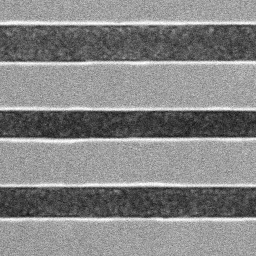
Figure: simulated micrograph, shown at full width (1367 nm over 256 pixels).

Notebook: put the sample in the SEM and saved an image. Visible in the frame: lines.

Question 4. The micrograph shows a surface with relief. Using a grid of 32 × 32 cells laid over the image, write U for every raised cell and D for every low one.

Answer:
UUUUUUUUUUUUUUUUUUUUUUUUUUUUUUUU
UUUUUUUUUUUUUUUUUUUUUUUUUUUUUUUU
UUUUUUUUUUUUUUUUUUUUUUUUUUUUUUUU
DDDDDDDDDDDDDDDDDDDDDDDDDDDDDDDD
DDDDDDDDDDDDDDDDDDDDDDDDDDDDDDDD
DDDDDDDDDDDDDDDDDDDDDDDDDDDDDDDD
DDDDDDDDDDDDDDDDDDDDDDDDDDDDDDDD
DDDDDDDDDDDDDDDDDDDDDDDDDDDDDDDD
UUUUUUUUUUUUUUUUUUUUUUUUUUUUUUUU
UUUUUUUUUUUUUUUUUUUUUUUUUUUUUUUU
UUUUUUUUUUUUUUUUUUUUUUUUUUUUUUUU
UUUUUUUUUUUUUUUUUUUUUUUUUUUUUUUU
UUUUUUUUUUUUUUUUUUUUUUUUUUUUUUUU
UUUUUUUUUUUUUUUUUUUUUUUUUUUUUUUU
DDDDDDDDDDDDDDDDDDDDDDDDDDDDDDDD
DDDDDDDDDDDDDDDDDDDDDDDDDDDDDDDD
DDDDDDDDDDDDDDDDDDDDDDDDDDDDDDDD
UUUUUUUUUUUUUUUUUUUUUUUUUUUUUUUU
UUUUUUUUUUUUUUUUUUUUUUUUUUUUUUUU
UUUUUUUUUUUUUUUUUUUUUUUUUUUUUUUU
UUUUUUUUUUUUUUUUUUUUUUUUUUUUUUUU
UUUUUUUUUUUUUUUUUUUUUUUUUUUUUUUU
UUUUUUUUUUUUUUUUUUUUUUUUUUUUUUUU
DDDDDDDDDDDDDDDDDDDDDDDDDDDDDDDD
DDDDDDDDDDDDDDDDDDDDDDDDDDDDDDDD
DDDDDDDDDDDDDDDDDDDDDDDDDDDDDDDD
DDDDDDDDDDDDDDDDDDDDDDDDDDDDDDDD
UUUUUUUUUUUUUUUUUUUUUUUUUUUUUUUU
UUUUUUUUUUUUUUUUUUUUUUUUUUUUUUUU
UUUUUUUUUUUUUUUUUUUUUUUUUUUUUUUU
UUUUUUUUUUUUUUUUUUUUUUUUUUUUUUUU
UUUUUUUUUUUUUUUUUUUUUUUUUUUUUUUU